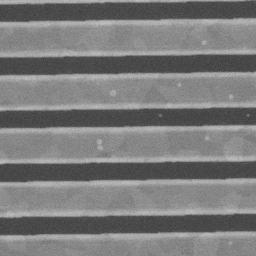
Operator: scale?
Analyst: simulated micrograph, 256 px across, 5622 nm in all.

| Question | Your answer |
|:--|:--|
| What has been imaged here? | lines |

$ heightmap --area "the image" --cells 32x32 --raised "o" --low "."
................................
................................
.............................ooo
oooooooooooooooooooooooooooooooo
oooooooooooooooooooooooooooooooo
oooooooooooooooooooooooooooooooo
oooooooooooooooooooooooooooooooo
................................
................................
.......ooooooooooooooooooooooooo
oooooooooooooooooooooooooooooooo
oooooooooooooooooooooooooooooooo
oooooooooooooooooooooooooooooooo
ooooooooo.......................
................................
................................
oooooooooooooooooooooooooooooooo
oooooooooooooooooooooooooooooooo
oooooooooooooooooooooooooooooooo
oooooooooooooooooooooooooooooooo
................................
................................
...........................ooooo
oooooooooooooooooooooooooooooooo
oooooooooooooooooooooooooooooooo
oooooooooooooooooooooooooooooooo
oooooooooooooooooooooooooooooooo
................................
................................
...ooooooooooooooooooooooooooooo
oooooooooooooooooooooooooooooooo
oooooooooooooooooooooooooooooooo